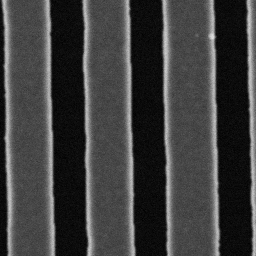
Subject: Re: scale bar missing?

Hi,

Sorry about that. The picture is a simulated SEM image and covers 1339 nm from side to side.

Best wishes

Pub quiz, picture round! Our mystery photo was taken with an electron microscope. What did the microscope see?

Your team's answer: lines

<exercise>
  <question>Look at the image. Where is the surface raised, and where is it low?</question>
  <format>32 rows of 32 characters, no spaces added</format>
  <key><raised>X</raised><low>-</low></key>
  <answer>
XXXXXX----XXXXXX----XXXXXXX----X
-XXXXX----XXXXXX-----XXXXXX----X
-XXXXX-----XXXXX-----XXXXXX----X
-XXXXX-----XXXXX-----XXXXXX----X
-XXXXX-----XXXXX-----XXXXXX----X
-XXXXX-----XXXXX-----XXXXXX----X
-XXXXX-----XXXXX-----XXXXXX----X
-XXXXX----XXXXXX-----XXXXXX----X
-XXXXX-----XXXXX-----XXXXXX----X
-XXXXX-----XXXXX-----XXXXXX----X
-XXXXX-----XXXXX-----XXXXXX----X
-XXXXX-----XXXXX-----XXXXXX----X
-XXXXX-----XXXXX-----XXXXXX----X
-XXXXX-----XXXXX-----XXXXXX----X
-XXXXX-----XXXXX-----XXXXXX----X
-XXXXX-----XXXXX-----XXXXXX----X
-XXXXXX----XXXXX-----XXXXXX----X
-XXXXXX----XXXXX-----XXXXXX----X
-XXXXXX----XXXXX-----XXXXXX----X
-XXXXXX----XXXXX-----XXXXXX----X
-XXXXXX----XXXXXX----XXXXXX----X
-XXXXXX----XXXXX-----XXXXXX-----
-XXXXXX----XXXXXX----XXXXXX-----
-XXXXXX----XXXXXX----XXXXXX-----
-XXXXXX----XXXXXX----XXXXXX-----
-XXXXXX----XXXXXX----XXXXXX-----
-XXXXXX----XXXXXX----XXXXXX-----
-XXXXXX----XXXXXX----XXXXXX-----
-XXXXXX----XXXXXX----XXXXXX-----
-XXXXXX----XXXXXX----XXXXXX-----
-XXXXXX----XXXXXX----XXXXXX-----
-XXXXXX----XXXXXX----XXXXXX-----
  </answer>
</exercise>